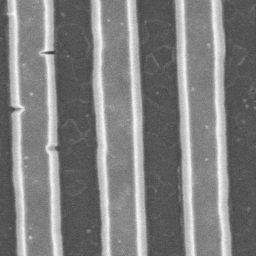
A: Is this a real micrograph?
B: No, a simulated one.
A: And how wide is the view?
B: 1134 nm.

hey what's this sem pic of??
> one or a few lines or trenches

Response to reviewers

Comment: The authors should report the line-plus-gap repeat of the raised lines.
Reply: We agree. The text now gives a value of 372 nanometres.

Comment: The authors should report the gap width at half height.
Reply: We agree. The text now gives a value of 46.5 px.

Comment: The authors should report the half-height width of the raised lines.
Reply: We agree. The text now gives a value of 36.9 px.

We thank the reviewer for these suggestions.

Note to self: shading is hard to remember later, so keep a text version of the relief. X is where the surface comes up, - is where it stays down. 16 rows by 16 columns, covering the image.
-XX---XX---XXX--
-XX---XX---XXX--
-XX---XX---XXX--
-XX---XX---XXX--
-XX---XX---XXX--
-XX---XX---XXX--
-XX---XXX--XXX--
-XX---XXX---XX--
-XX---XXX---XX--
-XX---XXX---XX--
-XX---XXX---XX--
-XX---XXX---XX--
-XX----XX---XX--
-XX----XX---XX--
-XXX---XX---XX--
-XXX---XX---XX--